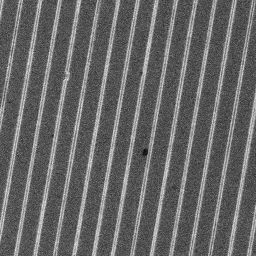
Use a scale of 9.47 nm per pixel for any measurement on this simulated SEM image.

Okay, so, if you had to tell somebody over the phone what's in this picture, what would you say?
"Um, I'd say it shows parallel lines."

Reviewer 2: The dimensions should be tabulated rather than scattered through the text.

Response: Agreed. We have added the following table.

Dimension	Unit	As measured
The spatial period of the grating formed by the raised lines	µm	0.181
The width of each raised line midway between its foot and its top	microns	0.0186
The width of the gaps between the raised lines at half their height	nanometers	159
